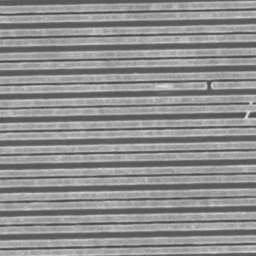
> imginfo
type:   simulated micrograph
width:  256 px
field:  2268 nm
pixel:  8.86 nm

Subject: parallel lines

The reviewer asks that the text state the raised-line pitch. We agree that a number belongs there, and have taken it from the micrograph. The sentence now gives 0.103 µm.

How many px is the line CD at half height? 7.51